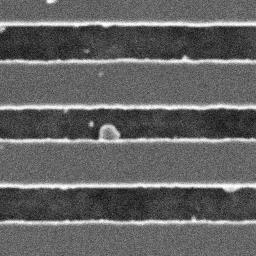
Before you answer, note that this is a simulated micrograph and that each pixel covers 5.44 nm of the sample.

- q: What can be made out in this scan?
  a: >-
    lines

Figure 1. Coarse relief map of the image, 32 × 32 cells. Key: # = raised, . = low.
################################
################################
################################
................................
................................
................................
................................
..............###.#.............
################################
################################
################################
################################
################################
###.##..#.##...#....##.###....##
................................
................................
................................
.....##..........#########..####
################################
################################
################################
################################
################################
................................
................................
................................
................................
................................
################################
################################
################################
################################